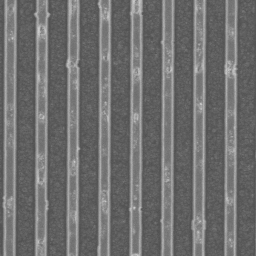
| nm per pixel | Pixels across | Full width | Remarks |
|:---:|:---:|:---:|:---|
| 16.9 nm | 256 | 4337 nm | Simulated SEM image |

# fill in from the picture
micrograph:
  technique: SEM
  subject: parallel lines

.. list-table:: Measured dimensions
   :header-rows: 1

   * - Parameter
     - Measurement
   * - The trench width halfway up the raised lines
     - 20.9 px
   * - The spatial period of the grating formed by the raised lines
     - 534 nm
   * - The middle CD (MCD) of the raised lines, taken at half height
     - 0.191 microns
